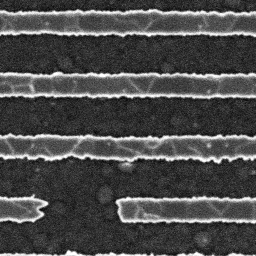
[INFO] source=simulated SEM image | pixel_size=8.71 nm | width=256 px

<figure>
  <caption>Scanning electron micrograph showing one or a few lines or trenches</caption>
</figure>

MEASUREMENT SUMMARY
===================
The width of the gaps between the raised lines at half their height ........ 343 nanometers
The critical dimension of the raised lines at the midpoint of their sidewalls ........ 196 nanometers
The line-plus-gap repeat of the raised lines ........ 0.539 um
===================